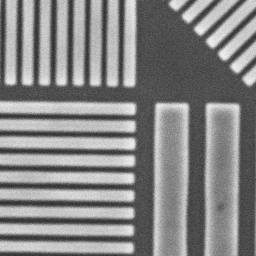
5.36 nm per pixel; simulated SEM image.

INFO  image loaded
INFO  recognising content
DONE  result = groups of lines, slits or small figures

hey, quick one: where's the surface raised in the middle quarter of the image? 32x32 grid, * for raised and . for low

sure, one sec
*.***..**..**..***..............
*.***..**..**..***..............
*.***..**..**..***..............
*.***..**..**..***..............
*.***..**..**..***..............
...............**...............
................................
................................
................................
................................
******************.....********.
******************.....********.
.......................********.
.......................********.
*****************......********.
******************.....********.
******************.....********.
.......................********.
.......................********.
******************.....********.
******************.....********.
.......................********.
.......................********.
******************.....********.
******************.....********.
.......................********.
.......................********.
************...........********.
*****************......********.
.****************......********.
.......................********.
.......................********.